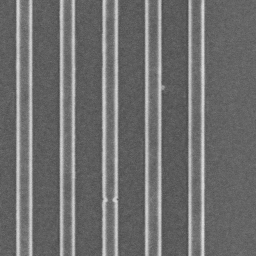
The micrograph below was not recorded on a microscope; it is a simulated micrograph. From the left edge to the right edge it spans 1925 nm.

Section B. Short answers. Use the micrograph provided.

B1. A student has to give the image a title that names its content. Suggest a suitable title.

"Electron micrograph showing parallel lines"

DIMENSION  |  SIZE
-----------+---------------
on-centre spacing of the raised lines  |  323 nanometers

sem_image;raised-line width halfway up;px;13.1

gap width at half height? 0.224 um